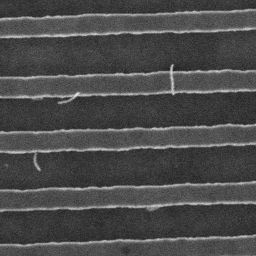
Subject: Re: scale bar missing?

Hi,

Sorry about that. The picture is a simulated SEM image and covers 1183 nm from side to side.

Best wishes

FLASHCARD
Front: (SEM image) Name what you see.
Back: lines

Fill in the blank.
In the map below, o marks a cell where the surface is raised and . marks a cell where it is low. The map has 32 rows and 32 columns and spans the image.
................................
.......................ooooooooo
oooooooooooooooooooooooooooooooo
oooooooooooooooooooooooooooooooo
ooooooooo.......................
................................
................................
................................
................................
.......ooooooooooooooooooooooooo
oooooooooooooooooooooooooooooooo
ooooooooooooooooooooooooooo.....
................................
................................
................................
................................
oooooooooooooooooooooooooooooooo
oooooooooooooooooooooooooooooooo
oooooooooooooooooo.oo...........
................................
................................
................................
................................
...........ooooooooooooooooooooo
oooooooooooooooooooooooooooooooo
ooooooooooooooooooooooooooo.....
................................
................................
................................
...............................o
....oooooooooooooooooooooooooooo
oooooooooooooooooooooooooooooooo